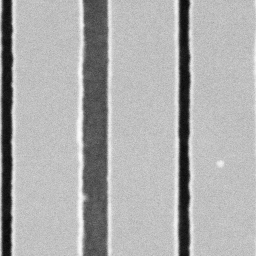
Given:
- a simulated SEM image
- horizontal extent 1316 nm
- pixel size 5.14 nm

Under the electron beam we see lines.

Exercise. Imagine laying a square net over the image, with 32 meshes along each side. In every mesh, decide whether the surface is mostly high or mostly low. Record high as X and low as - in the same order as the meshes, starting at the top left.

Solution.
--XXXXXXXX----XXXXXXXX--XXXXXXXX
--XXXXXXXX----XXXXXXXX--XXXXXXXX
--XXXXXXXX----XXXXXXXX--XXXXXXXX
--XXXXXXXX----XXXXXXXX--XXXXXXXX
--XXXXXXXX----XXXXXXXX--XXXXXXXX
--XXXXXXXX----XXXXXXXX--XXXXXXXX
--XXXXXXXX----XXXXXXXX--XXXXXXXX
--XXXXXXXX----XXXXXXXX--XXXXXXXX
--XXXXXXXX----XXXXXXXX--XXXXXXXX
--XXXXXXXX----XXXXXXXX--XXXXXXXX
--XXXXXXXX----XXXXXXXX--XXXXXXXX
--XXXXXXXX----XXXXXXXX--XXXXXXXX
--XXXXXXXX----XXXXXXXX--XXXXXXXX
--XXXXXXXX----XXXXXXXX--XXXXXXXX
-XXXXXXXXX----XXXXXXXX--XXXXXXXX
--XXXXXXXX----XXXXXXXX--XXXXXXXX
--XXXXXXXX----XXXXXXXX--XXXXXXXX
-XXXXXXXXX----XXXXXXXX--XXXXXXXX
--XXXXXXXX----XXXXXXXX--XXXXXXXX
--XXXXXXXX----XXXXXXXX--XXXXXXXX
--XXXXXXXX----XXXXXXXX--XXXXXXXX
--XXXXXXXX----XXXXXXXX--XXXXXXXX
-XXXXXXXXX---XXXXXXXXX--XXXXXXXX
--XXXXXXXX----XXXXXXXX--XXXXXXXX
-XXXXXXXXX----XXXXXXXX--XXXXXXXX
--XXXXXXXX----XXXXXXXX--XXXXXXXX
-XXXXXXXXX----XXXXXXXX--XXXXXXXX
-XXXXXXXXX----XXXXXXXX--XXXXXXXX
-XXXXXXXXX----XXXXXXXX--XXXXXXXX
-XXXXXXXXX----XXXXXXXX--XXXXXXXX
-XXXXXXXXX----XXXXXXXX--XXXXXXXX
-XXXXXXXXX----XXXXXXXX--XXXXXXXX